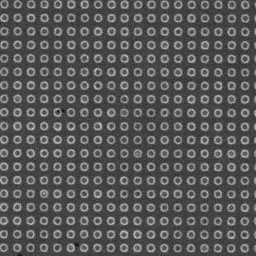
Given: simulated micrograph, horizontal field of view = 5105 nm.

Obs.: a regular array of raised bodies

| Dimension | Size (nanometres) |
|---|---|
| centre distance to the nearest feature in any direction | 262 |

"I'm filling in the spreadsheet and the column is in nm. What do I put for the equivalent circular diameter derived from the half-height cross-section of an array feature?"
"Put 144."